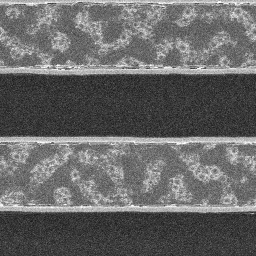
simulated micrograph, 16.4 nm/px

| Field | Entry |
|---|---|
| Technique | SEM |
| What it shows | one or a few lines or trenches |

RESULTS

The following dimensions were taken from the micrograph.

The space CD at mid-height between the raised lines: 1130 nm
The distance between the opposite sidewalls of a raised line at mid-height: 1.14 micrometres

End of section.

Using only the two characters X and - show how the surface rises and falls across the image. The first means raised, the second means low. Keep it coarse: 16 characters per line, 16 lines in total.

XXXXXXXXXXXXXXXX
XXXXXXXXXXXXXXXX
XXXXXXXXXXXXXXXX
XXXXXXXXXXXXXXXX
----------------
----------------
----------------
----------------
----------------
XXXXXXXXXXXXXXXX
XXXXXXXXXXXXXXXX
XXXXXXXXXXXXXXXX
XXXXXXXXXXXXXXXX
----------------
----------------
----------------